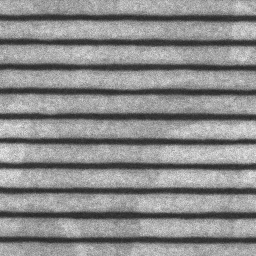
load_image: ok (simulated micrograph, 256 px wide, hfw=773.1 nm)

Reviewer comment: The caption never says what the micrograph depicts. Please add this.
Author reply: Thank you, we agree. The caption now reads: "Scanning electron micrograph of parallel lines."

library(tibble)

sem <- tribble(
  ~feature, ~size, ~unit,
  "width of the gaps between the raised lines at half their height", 0.0219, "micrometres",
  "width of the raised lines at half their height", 52.9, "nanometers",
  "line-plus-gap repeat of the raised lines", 74.7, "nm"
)